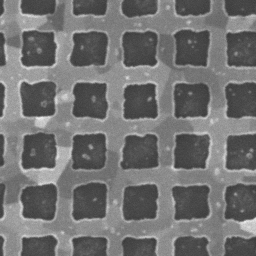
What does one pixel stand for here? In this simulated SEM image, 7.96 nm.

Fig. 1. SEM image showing a regular array of holes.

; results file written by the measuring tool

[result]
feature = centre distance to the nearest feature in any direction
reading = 399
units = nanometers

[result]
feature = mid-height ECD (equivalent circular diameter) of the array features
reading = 310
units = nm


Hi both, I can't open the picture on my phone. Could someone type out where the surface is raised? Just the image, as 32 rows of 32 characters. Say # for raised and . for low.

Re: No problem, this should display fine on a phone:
###....##....##.....##....##....
.##....##....##.....##....##....
################################
################################
.##....##....##.....##....##....
.##....##.....#.....##....##....
.##....##....##.....##....##....
.##....##....##.....##....##....
################################
################################
###....##....#####.###....##....
.#.....##....##....###....##....
.##....##....##....###....##....
.##....##.....#.....##....##....
###...###....###....##....##....
################################
################################
.##....##....###....##....##....
.##....##....##.....##....##....
###....##....##.....##....##....
###....##....##.....##....##....
################################
################################
.##....##....###....##....##....
.##....##....##.....##....##....
###....##....##.....##....##....
.##....##....##.....##....##....
#####.###.######..####..#####..#
################################
######.################.########
###....##....##.....##....##....
###....##....##.....##....##....